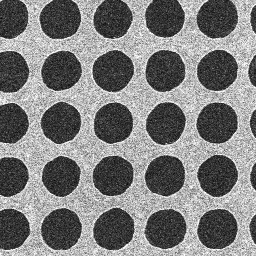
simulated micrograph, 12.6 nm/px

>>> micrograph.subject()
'a regular array of holes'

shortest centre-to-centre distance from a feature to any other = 0.655 um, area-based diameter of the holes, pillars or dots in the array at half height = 519 nm